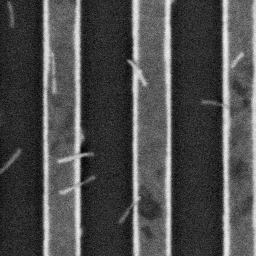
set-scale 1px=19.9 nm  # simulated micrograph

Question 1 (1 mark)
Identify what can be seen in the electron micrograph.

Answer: lines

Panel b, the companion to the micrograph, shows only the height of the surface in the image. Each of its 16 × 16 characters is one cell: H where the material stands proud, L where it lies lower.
LLLHHLLLHHHLLLHH
LLLHHLLLHHHLLLHH
LLLHHLLLHHHLLLHH
LLLHHLLLHHHLLLHH
LLLHHLLLHHHLLLHH
LLLHHLLLHHHLLLHH
LLLHHLLLHHHLLLHH
LLLHHLLLHHHLLLHH
LLLHHLLLHHHLLLHH
LLLHHLLLHHHLLLHH
LLLHHLLLHHHLLLHH
LLLHHLLLHHHLLLHH
LLLHHLLLHHHLLLHH
LLLHHLLLHHHLLLHH
LLLHHLLLHHHLLLHH
LLLHHLLLHHHLLLHH